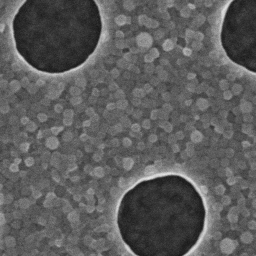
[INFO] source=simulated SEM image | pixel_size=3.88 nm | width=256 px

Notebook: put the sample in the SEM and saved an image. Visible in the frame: holes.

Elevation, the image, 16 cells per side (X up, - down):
X-----XXXXXXXX--
X-----XXXXXXXX--
X-----XXXXXXXX--
X-----XXXXXXXX--
XXX-XXXXXXXXXXXX
XXXXXXXXXXXXXXXX
XXXXXXXXXXXXXXXX
XXXXXXXXXXXXXXXX
XXXXXXXXXXXXXXXX
XXXXXXXXXXXXXXXX
XXXXXXXXXXXXXXXX
XXXXXXXXX---XXXX
XXXXXXXX-----XXX
XXXXXXX------XXX
XXXXXXXX-----XXX
XXXXXXXX----XXXX